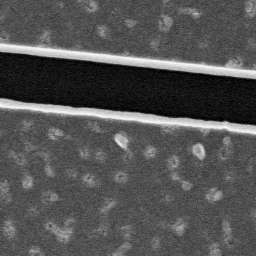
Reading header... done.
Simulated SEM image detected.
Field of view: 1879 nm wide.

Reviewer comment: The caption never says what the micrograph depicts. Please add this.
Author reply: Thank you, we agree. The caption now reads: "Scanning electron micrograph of one or a few lines or trenches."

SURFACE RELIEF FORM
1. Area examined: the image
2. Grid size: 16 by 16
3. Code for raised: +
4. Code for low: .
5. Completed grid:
++++++++++++++++
++++++++++++++++
++++++++++++++++
.....+++++++++++
..............++
................
................
++++++++++......
++++++++++++++++
++++++++++++++++
++++++++++++++++
++++++++++++++++
++++++++++++++++
++++++++++++++++
++++++++++++++++
++++++++++++++++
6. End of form